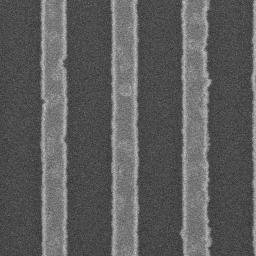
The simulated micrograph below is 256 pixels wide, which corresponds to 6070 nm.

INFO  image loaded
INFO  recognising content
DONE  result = one or a few lines or trenches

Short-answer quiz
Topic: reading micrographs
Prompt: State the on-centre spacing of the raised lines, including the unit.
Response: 70.6 px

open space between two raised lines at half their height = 1170 nanometres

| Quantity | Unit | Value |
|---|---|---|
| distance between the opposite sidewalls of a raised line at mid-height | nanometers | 492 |